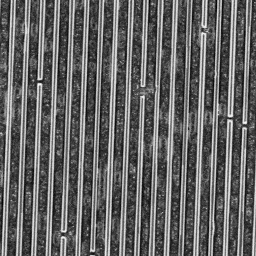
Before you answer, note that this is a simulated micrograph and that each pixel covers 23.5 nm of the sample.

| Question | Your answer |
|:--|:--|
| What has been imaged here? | parallel lines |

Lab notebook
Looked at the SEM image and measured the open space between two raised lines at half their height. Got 267 nanometers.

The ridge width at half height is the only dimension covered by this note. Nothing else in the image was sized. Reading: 88.1 nm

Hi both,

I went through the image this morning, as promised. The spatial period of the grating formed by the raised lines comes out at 0.346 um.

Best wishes